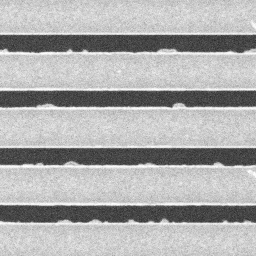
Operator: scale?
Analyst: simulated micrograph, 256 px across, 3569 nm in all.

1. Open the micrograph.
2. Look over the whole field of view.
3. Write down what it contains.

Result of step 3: lines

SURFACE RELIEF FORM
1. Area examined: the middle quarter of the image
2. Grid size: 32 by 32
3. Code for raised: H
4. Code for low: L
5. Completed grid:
HHHHHHHHHHHHHHHHHHHHHHHHHHHHHHHH
HHHHHHHHHHHHHHHHHHHHHHHHHHHHHHHH
HHHHHHHHHHHHHHHHHHHHHHHHHHHHHHHH
HHHHHHHHHHHHHHHHHHHHHHHHHHHHHHHH
HHHHHHHHHHHHHHHHHHHHHHHHHHHHHHHH
HHHHHHHHHHHHHHHHHHHHHHHHHHHHHHHH
LLLLLLLLLLLLLLLLLLLLLLLLLLLLLLLL
LLLLLLLLLLLLLLLLLLLLLLLLLLLLLLLL
LLLLLLLLLLLLLLLLLLLLLLLLLLLLLLLL
LLLLLLLLLLLLLLLLLLLLLLLLLLLLLLLL
LLLLLLLLLLLLLLLLLLLLLLLLLLLLLLLL
HHHHHHHHHHHHHHHHHHHHHHHHHHHHHHHH
HHHHHHHHHHHHHHHHHHHHHHHHHHHHHHHH
HHHHHHHHHHHHHHHHHHHHHHHHHHHHHHHH
HHHHHHHHHHHHHHHHHHHHHHHHHHHHHHHH
HHHHHHHHHHHHHHHHHHHHHHHHHHHHHHHH
HHHHHHHHHHHHHHHHHHHHHHHHHHHHHHHH
HHHHHHHHHHHHHHHHHHHHHHHHHHHHHHHH
HHHHHHHHHHHHHHHHHHHHHHHHHHHHHHHH
HHHHHHHHHHHHHHHHHHHHHHHHHHHHHHHH
HHHHHHHHHHHHHHHHHHHHHHHHHHHHHHHH
LLLLLLLLLLLLLLLLLLLLLLLLLLLLLLLL
LLLLLLLLLLLLLLLLLLLLLLLLLLLLLLLL
LLLLLLLLLLLLLLLLLLLLLLLLLLLLLLLL
LLLLLLLLLLLLLLLLLLLLLLLLLLLLLLLL
LLLLLLLLLLLLLLLLLLLLLLLLLLLLLLLL
HHHHHHHHHHHHHHHHHHHHHHHHHHHHHHHH
HHHHHHHHHHHHHHHHHHHHHHHHHHHHHHHH
HHHHHHHHHHHHHHHHHHHHHHHHHHHHHHHH
HHHHHHHHHHHHHHHHHHHHHHHHHHHHHHHH
HHHHHHHHHHHHHHHHHHHHHHHHHHHHHHHH
HHHHHHHHHHHHHHHHHHHHHHHHHHHHHHHH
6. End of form